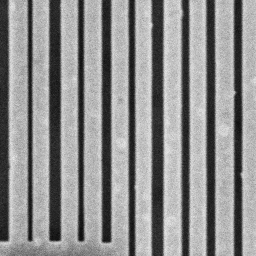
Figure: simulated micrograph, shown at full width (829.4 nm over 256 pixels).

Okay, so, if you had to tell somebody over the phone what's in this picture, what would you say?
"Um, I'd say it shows parallel lines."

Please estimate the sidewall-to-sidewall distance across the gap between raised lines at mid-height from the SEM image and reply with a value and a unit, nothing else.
27.5 nm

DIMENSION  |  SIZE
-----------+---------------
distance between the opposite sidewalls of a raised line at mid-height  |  55.5 nanometers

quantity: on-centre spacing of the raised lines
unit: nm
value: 83.7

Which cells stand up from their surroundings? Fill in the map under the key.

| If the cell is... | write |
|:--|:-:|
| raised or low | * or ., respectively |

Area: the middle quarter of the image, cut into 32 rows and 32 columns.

***..****...****..****...****..*
***..****...****..****...****..*
***..****...****..****...****..*
***..****...****..****...****..*
***..****...****..****...****..*
***..****...****..****...****..*
***..****...****..****...****..*
***..****...****..****...****..*
***..****...****..****...****..*
***..****...****..****...****..*
***..****...****..****...****..*
***..****...****..****...****..*
***..****...****..****...****...
***..****...****..****...****...
***..****...****..****...****...
***..****...****..****...****...
***..****...****..****...****...
***..****...****..****...****...
***..****...****..****...****...
***..****...****..****...****...
***..****...****..****...****...
***..****...****..****...****...
***..****...****..****...****...
***..****...****..****...****...
***..****...****..****...****...
***..****...****..****...****...
***..****...****..****...****..*
***..****...****..****...****..*
***..****...****..****...****..*
***..****...****..****...****..*
***..****...****..****...****..*
***..****...****..****...****...